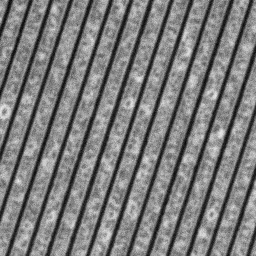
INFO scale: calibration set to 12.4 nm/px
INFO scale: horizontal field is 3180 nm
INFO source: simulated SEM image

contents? parallel lines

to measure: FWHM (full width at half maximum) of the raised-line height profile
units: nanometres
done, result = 165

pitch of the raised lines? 237 nm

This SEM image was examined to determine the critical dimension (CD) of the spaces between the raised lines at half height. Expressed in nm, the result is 76.7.